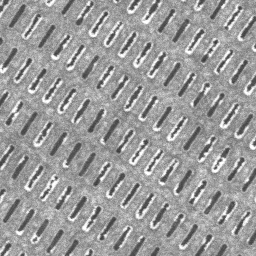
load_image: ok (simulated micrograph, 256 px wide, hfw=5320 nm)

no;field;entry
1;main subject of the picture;a regular array of holes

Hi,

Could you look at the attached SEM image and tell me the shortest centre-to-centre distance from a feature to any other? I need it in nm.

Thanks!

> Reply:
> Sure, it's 368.